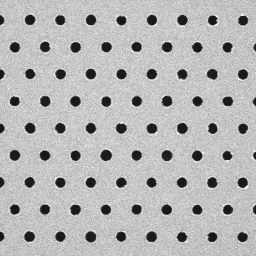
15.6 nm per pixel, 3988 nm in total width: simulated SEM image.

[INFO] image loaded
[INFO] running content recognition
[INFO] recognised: a regular array of holes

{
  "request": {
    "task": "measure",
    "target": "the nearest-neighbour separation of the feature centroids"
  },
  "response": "468 nanometers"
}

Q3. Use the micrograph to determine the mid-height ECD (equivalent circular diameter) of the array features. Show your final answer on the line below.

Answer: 10.6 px